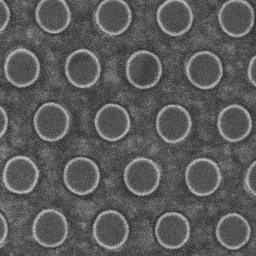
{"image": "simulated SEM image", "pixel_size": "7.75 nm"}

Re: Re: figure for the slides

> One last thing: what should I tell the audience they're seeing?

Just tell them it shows a regular array of raised bodies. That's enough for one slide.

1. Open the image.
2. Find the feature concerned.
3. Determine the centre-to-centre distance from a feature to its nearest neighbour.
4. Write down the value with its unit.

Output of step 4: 0.47 um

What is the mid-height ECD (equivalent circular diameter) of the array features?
270 nanometers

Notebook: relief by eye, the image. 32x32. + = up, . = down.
+....+++.....+++.....++.....+++.
+....++++...++++....++++...+++++
+....++++...++++....++++...+++++
.....+++.....+++....++++....+++.
................................
................................
..++.....++......+..............
.++++...++++....++++....+++.....
.++++...++++....++++...+++++...+
.++++...++++....++++....++++...+
..++.....++......++.....+++.....
................................
................................
.....+++.....++......++.....++..
+....+++....++++....++++...++++.
+...++++....++++....++++...++++.
.....+++....++++....++++....+++.
......+.......+......+.......+..
................................
................................
.+++.....+++....+++.....+++.....
.++++...++++....++++...++++....+
.++++...++++....++++...++++....+
.+++.....+++....+++.....+++....+
................................
................................
.....++......+..................
+...++++....++++....+++.....+++.
+...++++....++++....++++...++++.
+...++++....++++....++++...++++.
.....++......++.....+++.....++..
................................